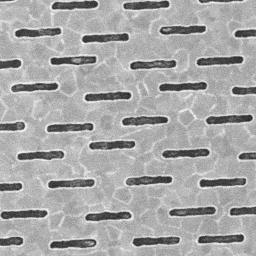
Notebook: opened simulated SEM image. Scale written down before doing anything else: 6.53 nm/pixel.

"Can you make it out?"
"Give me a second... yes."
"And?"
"a regular array of holes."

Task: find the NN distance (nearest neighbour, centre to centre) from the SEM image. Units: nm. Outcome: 273